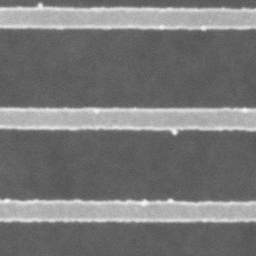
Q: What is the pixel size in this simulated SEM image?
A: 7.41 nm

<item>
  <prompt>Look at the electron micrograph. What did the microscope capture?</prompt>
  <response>lines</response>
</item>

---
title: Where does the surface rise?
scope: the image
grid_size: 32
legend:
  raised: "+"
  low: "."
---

................................
++++++++++++++++++++++++++++++++
++++++++++++++++++++++++++++++++
.......+....++...+++++++++++++++
................................
................................
................................
................................
................................
................................
................................
................................
................................
................................
++++++++++++++++++++++++++++++++
++++++++++++++++++++++++++++++++
................................
................................
................................
................................
................................
................................
................................
................................
................................
++++++++++++++++++++++++++++++++
++++++++++++++++++++++++++++++++
++++++++++++++++++++++++++++++++
................................
................................
................................
................................